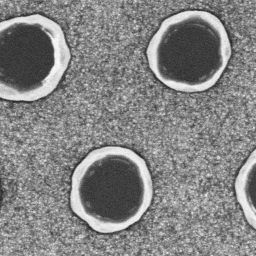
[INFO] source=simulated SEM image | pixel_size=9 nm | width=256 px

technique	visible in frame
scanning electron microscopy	raised bodies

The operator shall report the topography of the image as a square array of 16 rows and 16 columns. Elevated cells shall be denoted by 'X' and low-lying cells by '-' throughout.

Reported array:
----------------
-XX--------XXX--
XXXX------XXXX--
XXXX------XXXX--
XXXX------XXXX--
XXX-------------
----------------
----------------
----------------
-------X--------
-----XXXX-------
-----XXXX------X
-----XXXX------X
-----XXXX-------
----------------
----------------